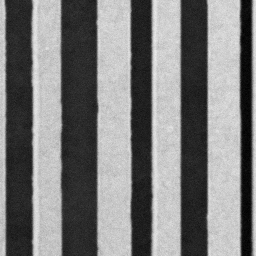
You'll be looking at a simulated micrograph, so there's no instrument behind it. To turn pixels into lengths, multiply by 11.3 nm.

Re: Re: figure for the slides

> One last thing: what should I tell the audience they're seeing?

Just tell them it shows lines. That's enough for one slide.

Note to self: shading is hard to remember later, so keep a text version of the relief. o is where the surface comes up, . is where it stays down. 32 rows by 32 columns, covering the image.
o...oooo....oooo...ooo....oooo..
o...oooo....oooo...ooo....oooo..
o...oooo....oooo...ooo....oooo..
o...oooo....oooo...ooo....oooo..
o...oooo....oooo...ooo....oooo..
o...oooo....oooo...ooo....oooo..
o...oooo....oooo...ooo....oooo..
o...oooo....oooo...ooo....oooo..
o...oooo....oooo...ooo....oooo..
o...oooo....oooo...ooo....oooo..
o...oooo....oooo...ooo....oooo..
o...oooo....oooo...ooo....oooo..
o...oooo....oooo...ooo....oooo..
o...oooo....oooo...ooo....oooo..
o...oooo....oooo...ooo....oooo..
o...oooo....oooo...ooo....oooo..
o...oooo....oooo...ooo....oooo..
o...oooo....oooo...ooo....oooo..
o...oooo....oooo...ooo....oooo..
o...oooo....oooo...ooo....oooo..
o...oooo....oooo...ooo....oooo..
o...oooo....oooo...ooo....oooo..
o...oooo....oooo...ooo....oooo..
o...oooo....oooo...ooo....oooo..
o...oooo....oooo...ooo....oooo..
o...oooo....oooo...ooo....oooo..
o...oooo....oooo...ooo....oooo..
o...oooo....oooo...ooo....oooo..
o...oooo....oooo...ooo....oooo..
o...oooo....oooo...ooo....oooo..
o...oooo....oooo...ooo....oooo..
o...oooo....oooo...ooo....oooo..